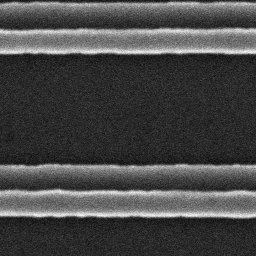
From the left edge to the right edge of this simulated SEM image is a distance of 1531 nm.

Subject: lines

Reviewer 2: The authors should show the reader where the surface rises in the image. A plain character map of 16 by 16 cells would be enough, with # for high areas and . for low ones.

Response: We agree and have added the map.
################
################
################
................
................
................
................
................
................
................
################
################
################
..######.#######
................
................